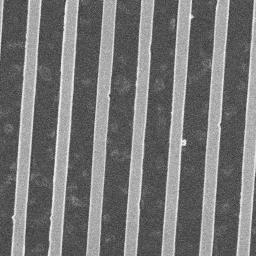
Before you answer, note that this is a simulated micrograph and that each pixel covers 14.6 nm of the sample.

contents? parallel lines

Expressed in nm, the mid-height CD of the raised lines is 185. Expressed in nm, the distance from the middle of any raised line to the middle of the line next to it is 546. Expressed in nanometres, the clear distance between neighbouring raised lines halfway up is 371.